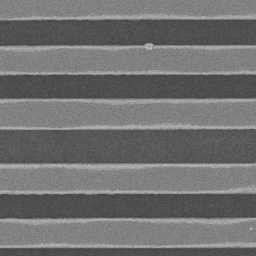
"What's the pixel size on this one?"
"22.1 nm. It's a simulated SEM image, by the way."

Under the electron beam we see lines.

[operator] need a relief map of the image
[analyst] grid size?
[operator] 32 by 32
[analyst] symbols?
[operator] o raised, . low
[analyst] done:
oooooooooooooooooooooooooooooooo
oooooooooooooooooooooooooooooooo
................................
................................
................................
..................o.............
oooooooooooooooooooooooooooooooo
oooooooooooooooooooooooooooooooo
oooooooooooooooooooooooooooooooo
................................
................................
................................
oooooooooooooooooooooooooooooooo
oooooooooooooooooooooooooooooooo
oooooooooooooooooooooooooooooooo
oooooooooooooooooooooooooooooooo
................................
................................
................................
................................
...............................o
oooooooooooooooooooooooooooooooo
oooooooooooooooooooooooooooooooo
oooooooooooooooooooooooooooooooo
................................
................................
................................
oooooooooooooooooooooooooooooooo
oooooooooooooooooooooooooooooooo
oooooooooooooooooooooooooooooooo
oooooooooooooooooooooooooooooooo
................................